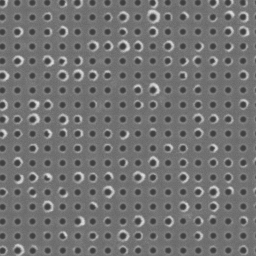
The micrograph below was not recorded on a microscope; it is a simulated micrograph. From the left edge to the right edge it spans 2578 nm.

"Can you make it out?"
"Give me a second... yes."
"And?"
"a regular array of holes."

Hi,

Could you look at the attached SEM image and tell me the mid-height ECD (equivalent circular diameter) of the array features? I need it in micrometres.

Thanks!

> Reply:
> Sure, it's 0.0643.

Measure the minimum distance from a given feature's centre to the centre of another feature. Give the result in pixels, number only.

14.5